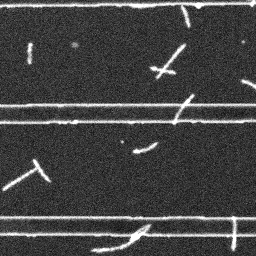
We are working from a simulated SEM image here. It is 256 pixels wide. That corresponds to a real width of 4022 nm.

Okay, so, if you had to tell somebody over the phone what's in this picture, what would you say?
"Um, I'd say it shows lines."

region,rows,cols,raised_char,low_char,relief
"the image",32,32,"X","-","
XXXXXXXXXXXXXXXXXXXXXX--XX-----X
--------------------------------
--------------------------------
--------------------------------
--------------------------------
--------------------------------
--------------------------------
--------------------------------
--------------------------------
--------------------------------
--------------------------------
--------------------------------
--------------------------------
XXXXXXXXXXXXXXXXXXXXXXXXXXXXXXXX
XXXXXXXXXXXXXXXXXXXXXXXXXXXXXXXX
--------------------------------
--------------------------------
--------------------------------
--------------------------------
--------------------------------
--------------------------------
--------------------------------
--------------------------------
--------------------------------
--------------------------------
--------------------------------
--------------------------------
XXXXXXXXXXXXXXXXXXXXXXXXXXXXXXXX
XXXXXXXXXXXXXXXXXXXXXXXXXXXXXXXX
----------------XX---X------XX--
--------------------------------
--------------------------------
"